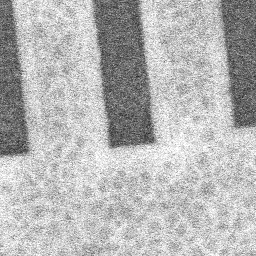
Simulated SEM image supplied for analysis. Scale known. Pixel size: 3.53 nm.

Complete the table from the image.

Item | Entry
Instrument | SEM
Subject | one or a few lines or trenches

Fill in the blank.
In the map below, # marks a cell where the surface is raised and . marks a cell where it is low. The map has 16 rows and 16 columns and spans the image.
.####....####...
..###....####...
..###.....###...
..####....####..
..####....####..
..####....####..
..####....####..
..####....####..
..####....####..
..####....######
################
################
################
################
################
################